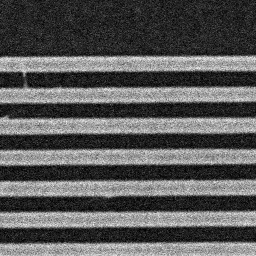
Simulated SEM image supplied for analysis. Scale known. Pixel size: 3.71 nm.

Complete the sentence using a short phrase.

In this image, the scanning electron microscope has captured parallel lines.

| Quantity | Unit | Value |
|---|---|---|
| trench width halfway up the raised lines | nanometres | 63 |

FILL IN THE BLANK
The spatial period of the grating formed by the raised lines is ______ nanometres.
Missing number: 115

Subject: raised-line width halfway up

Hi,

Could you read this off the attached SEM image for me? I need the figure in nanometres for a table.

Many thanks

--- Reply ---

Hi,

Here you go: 52.8